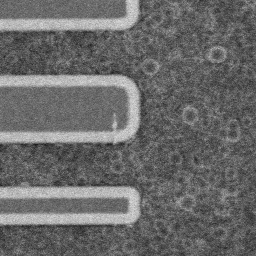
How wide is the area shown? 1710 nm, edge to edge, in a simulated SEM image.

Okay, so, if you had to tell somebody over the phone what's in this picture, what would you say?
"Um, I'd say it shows one or a few lines or trenches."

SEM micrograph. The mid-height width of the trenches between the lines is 56.9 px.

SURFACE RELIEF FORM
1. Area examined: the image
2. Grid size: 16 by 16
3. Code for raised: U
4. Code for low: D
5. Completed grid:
UUUUUUUUDDDDDDDD
UDDDDDDDDDDDDDDD
DDDDDDDDDDDDDDDD
DDDDDDDDDDDDDDDD
DDDDDDDDDDDDDDDD
UUUUUUUUDDDDDDDD
UUUUUUUUDDDDDDDD
UUUUUUUUDDDDDDDD
UUUUUUUUDDDDDDDD
DDDDDDDDDDDDDDDD
DDDDDDDDDDDDDDDD
DDDDDDDDDDDDDDDD
UUUUUUUUDDDDDDDD
UUUUUUUUDDDDDDDD
DDDDDDDDDDDDDDDD
DDDDDDDDDDDDDDDD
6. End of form